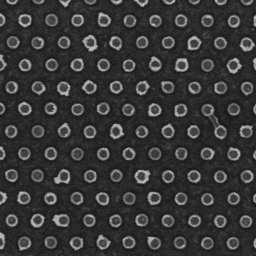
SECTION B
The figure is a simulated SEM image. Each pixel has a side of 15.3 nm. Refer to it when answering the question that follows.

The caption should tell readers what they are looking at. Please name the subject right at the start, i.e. a regular array of raised bodies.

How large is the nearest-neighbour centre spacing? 385 nanometers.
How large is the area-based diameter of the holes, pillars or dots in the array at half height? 185 nm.